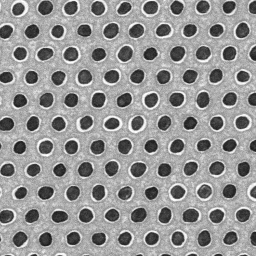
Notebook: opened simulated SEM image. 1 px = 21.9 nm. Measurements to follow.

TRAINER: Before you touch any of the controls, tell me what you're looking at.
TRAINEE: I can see a regular array of holes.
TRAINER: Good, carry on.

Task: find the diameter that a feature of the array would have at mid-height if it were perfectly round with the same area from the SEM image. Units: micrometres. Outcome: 0.32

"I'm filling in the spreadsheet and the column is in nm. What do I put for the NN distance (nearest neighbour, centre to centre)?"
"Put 564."